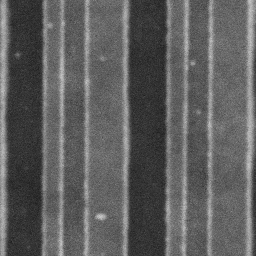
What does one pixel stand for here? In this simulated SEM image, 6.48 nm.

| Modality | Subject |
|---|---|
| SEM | lines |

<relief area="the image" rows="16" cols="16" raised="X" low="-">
---XXXXX--XXXXXX
---XXXXX--XXXXXX
---XXXXX--XXXXXX
---XXXXX--XXXXXX
---XXXXX--XXXXXX
---XXXXX--XXXXXX
---XXXXX--XXXXXX
---XXXXX--XXXXXX
---XXXXX--XXXXXX
---XXXXX--XXXXXX
---XXXXX--XXXXXX
---XXXXX--XXXXXX
---XXXXX--XXXXXX
---XXXXX--XXXXXX
---XXXXX--XXXXXX
---XXXXX--XXXXXX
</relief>